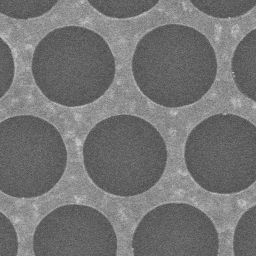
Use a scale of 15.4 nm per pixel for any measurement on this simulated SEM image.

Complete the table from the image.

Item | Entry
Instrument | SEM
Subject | holes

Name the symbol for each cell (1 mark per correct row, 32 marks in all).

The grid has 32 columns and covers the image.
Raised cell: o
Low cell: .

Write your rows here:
.......oooo.........oooo........
......oooooo......ooooooo......o
oooooooooooooooooooooooooooooooo
ooooooo....oooooooo.....oooooooo
oooooo.......ooooo........ooooo.
.oooo........oooo.........oooo..
.ooo..........ooo..........oo...
..oo..........oo...........oo...
..oo...........o...........oo...
..oo..........ooo..........oo...
.oooo.........ooo..........oo...
.oooo........ooooo........oooo..
oooooo......ooooooo......oooooo.
oooooooooooooooooooooooooooooooo
oo..oooooooooo...ooooooooo....oo
......oooooo.......oooooo.......
.......oooo.........oooo........
........ooo..........oo.........
........oo...........oo.........
........oo...........oo.........
........oo...........oo.........
........ooo..........ooo........
.......oooo.........oooo........
.......ooooo.......oooooo......o
o....oooooooooo..ooooooooooooooo
ooooooooooooooooooooo...oooooooo
oooooo.......oooooo......oooooo.
.oooo.........oooo........oooo..
..oo..........ooo..........oo...
..oo...........oo..........oo...
..oo...........o...........oo...
..oo...........oo..........oo...